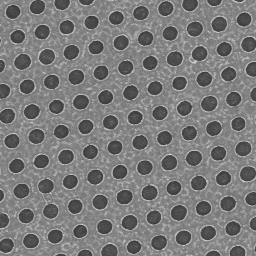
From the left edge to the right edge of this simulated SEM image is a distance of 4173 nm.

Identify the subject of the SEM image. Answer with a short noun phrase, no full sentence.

a regular array of holes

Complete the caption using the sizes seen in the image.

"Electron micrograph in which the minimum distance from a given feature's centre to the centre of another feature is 406 nm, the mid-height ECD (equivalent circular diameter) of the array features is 247 nm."